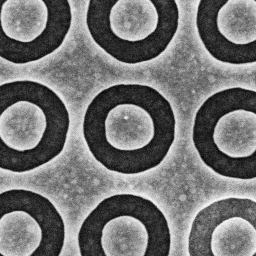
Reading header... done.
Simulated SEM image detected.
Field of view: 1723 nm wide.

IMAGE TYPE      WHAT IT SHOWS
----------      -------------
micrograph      ring-shaped grooves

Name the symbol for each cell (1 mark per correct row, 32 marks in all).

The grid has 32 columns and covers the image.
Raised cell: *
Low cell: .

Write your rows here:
.*****...**...*****...***...****
******...**...******..***..*****
******...**...******..***..*****
******...**...*****...***..*****
.****...***....***....***...****
........****.........****.......
.......******.......******......
*....**********....********.....
********************************
********************************
.....***********.***************
.......******.......*******.....
........****.........*****......
.****...***...***....****.......
******...**..******...**....****
******...*...******...**...*****
*****....*...******...**...*****
*****...***..******...**...*****
..**....***...***....***...*****
.......*****.........****....*..
.....********.......******......
**.************...*********.....
********************************
********************************
.....*********....**************
.......*****.......*******......
..*....****.........*****.......
****....***...***....***....***.
*****...**...*****...***...*****
*****...**...*****...***...*****
*****...**...*****...***..******
****....**...*****...***...*****